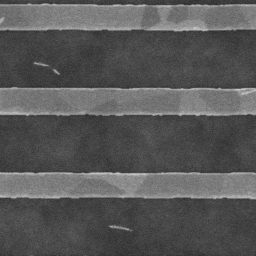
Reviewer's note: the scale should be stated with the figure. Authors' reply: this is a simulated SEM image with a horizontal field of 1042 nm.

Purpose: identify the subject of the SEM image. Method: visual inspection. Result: lines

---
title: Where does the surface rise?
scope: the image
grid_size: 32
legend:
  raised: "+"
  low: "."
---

................................
++++++++++++++++++++++++++++++++
++++++++++++++++++++++++++++++++
++++++++++++++++++++++++++++++++
................................
................................
................................
................................
................................
................................
................................
++++++++++++++++++++++++++++++++
++++++++++++++++++++++++++++++++
++++++++++++++++++++++++++++++++
................................
................................
................................
................................
................................
................................
................................
................................
++++++++++++++++++++++++++++++++
++++++++++++++++++++++++++++++++
++++++++++++++++++++++++++++++++
................................
................................
................................
................................
................................
................................
................................